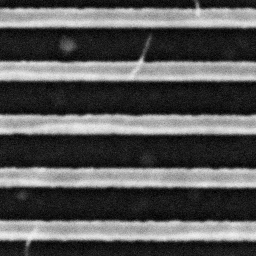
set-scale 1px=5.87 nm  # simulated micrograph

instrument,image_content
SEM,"lines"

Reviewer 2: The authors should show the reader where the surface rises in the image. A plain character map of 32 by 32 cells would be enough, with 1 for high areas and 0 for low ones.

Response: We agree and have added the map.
00000000000000000000000000000000
11111111111111111111111111111111
11111111111111111111111111111111
00000000000000000000000000000000
00000000000000000000000000000000
00000000000000000000000000000000
00000000000000000000000000000000
00000000000000000000000000000000
11111111111111111111111111111111
11111111111111111111111111111111
00000000000000000000000000000000
00000000000000000000000000000000
00000000000000000000000000000000
00000000000000000000000000000000
11111110111111111111111111111101
11111111111111111111111111111111
00000000000000000000000000000010
00000000000000000000000000000000
00000000000000000000000000000000
00000000000000000000000000000000
00000000000000000000000000000000
11111111111111111111111111111111
11111111111111111111111111111111
00000000000000000000000000000000
00000000000000000000000000000000
00000000000000000000000000000000
00000000000000000000000000000000
00000000000000000000000000000000
11111111111111111111111111111111
11111111111111111111111111111111
00000000000000000000000000000000
00000000000000000000000000000000